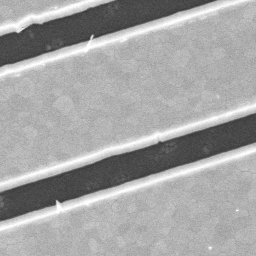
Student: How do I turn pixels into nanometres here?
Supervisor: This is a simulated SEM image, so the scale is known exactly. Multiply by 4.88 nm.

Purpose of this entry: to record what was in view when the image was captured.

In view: one or a few lines or trenches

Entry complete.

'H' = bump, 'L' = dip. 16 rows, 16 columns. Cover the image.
HHHHHLLLLLLLLHHH
HHLLLLLLLLHHHHHH
LLLLLLHHHHHHHHHH
LLLHHHHHHHHHHHHH
HHHHHHHHHHHHHHHH
HHHHHHHHHHHHHHHH
HHHHHHHHHHHHHHHH
HHHHHHHHHHHHHHLL
HHHHHHHHHHHLLLLL
HHHHHHHLLLLLLLLH
HHHHLLLLLLLLHHHH
HLLLLLLLHHHHHHHH
LLLLLHHHHHHHHHHH
LLHHHHHHHHHHHHHH
HHHHHHHHHHHHHHHH
HHHHHHHHHHHHHHHH